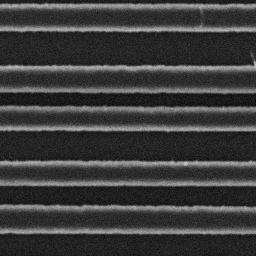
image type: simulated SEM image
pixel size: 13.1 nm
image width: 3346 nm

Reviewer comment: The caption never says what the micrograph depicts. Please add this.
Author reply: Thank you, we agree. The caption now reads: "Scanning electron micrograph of lines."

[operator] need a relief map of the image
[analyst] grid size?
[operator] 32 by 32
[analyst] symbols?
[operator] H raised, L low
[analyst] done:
LLLLLLLLLLLLLLLLLLLLLLLLLLLLLLLL
HHHHHHHHHHHHHHHHHHHHHHHHHHHHHHHH
HHHHHHHHHHHHHHHHHHHHHHHHHHHHHHHH
HHHHHHHHHHHHHHHHHHHHHHHHHHHHHHHH
LLLLLLLLLLLLLLLLLLLLLLLLLLLLLLLL
LLLLLLLLLLLLLLLLLLLLLLLLLLLLLLLL
LLLLLLLLLLLLLLLLLLLLLLLLLLLLLLLL
LLLLLLLLLLLLLLLLLLLLLLLLLLLLLLLL
HHHHHHHHHHHHHHHHHHHHHHHHHHHHHHHH
HHHHHHHHHHHHHHHHHHHHHHHHHHHHHHHH
HHHHHHHHHHHHHHHHHHHHHHHHHHHHHHHH
LLLLLLLLLLLLLLLLLLLLLLLLLLLLHLLL
LLLLLLLLLLLLLLLLLLLLLLLLLLLLLLLL
HHHLHLLLHLHLLHLLLLLLLLLLLLLLLLLL
HHHHHHHHHHHHHHHHHHHHHHHHHHHHHHHH
HHHHHHHHHHHHHHHHHHHHHHHHHHHHHHHH
LLLLLLLLLLLLLLLLLLLLLLLLLLLLLLLL
LLLLLLLLLLLLLLLLLLLLLLLLLLLLLLLL
LLLLLLLLLLLLLLLLLLLLLLLLLLLLLLLL
LLLLLLLLLLLLLLLLLLLLLLLLLLLLLLLL
HHHHHHHHHHHHHHHHHHHHHHHHHHHHHHHH
HHHHHHHHHHHHHHHHHHHHHHHHHHHHHHHH
HHHHHHHHHHHHHHHHHHHHHHHHHHHHHHHH
LLLLLLLLLLLLLLLLLLLLLLLLLLLLLLLL
LLLLLLLLLLLLLLLLLLLLLLLLLLLLLLLL
LLLLLLLLLLLLLLLLLLLLLLLLLLLLLLLL
HHHHHHHHHHHHHHHHHHHHHHHHHHHHHHHH
HHHHHHHHHHHHHHHHHHHHHHHHHHHHHHHH
HHHHHHHHHHHHHHHHHHHHHHHHHHHHHHHH
LLLLLLLLLLLLLLLLLLLLLLLLLLLLLLLL
LLLLLLLLLLLLLLLLLLLLLLLLLLLLLLLL
LLLLLLLLLLLLLLLLLLLLLLLLLLLLLLLL